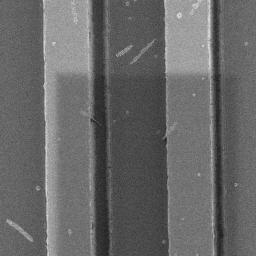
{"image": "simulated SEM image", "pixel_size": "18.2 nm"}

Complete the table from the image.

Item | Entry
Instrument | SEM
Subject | lines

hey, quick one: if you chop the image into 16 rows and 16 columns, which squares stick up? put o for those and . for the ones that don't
...oo.....ooo...
...ooo....ooo...
...ooo....ooo...
...ooo....ooo...
...ooo....ooo...
...ooo....ooo...
...ooo....ooo...
...ooo....ooo...
...ooo....ooo...
...ooo....ooo...
...ooo....ooo...
...ooo....ooo...
...ooo.....oo...
...ooo.....oo...
...ooo.....oo...
...ooo.....oo...